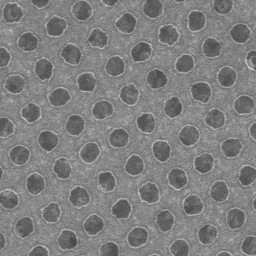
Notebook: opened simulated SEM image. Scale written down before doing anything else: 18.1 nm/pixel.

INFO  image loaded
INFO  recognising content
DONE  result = a regular array of raised bodies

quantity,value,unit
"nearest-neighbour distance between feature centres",562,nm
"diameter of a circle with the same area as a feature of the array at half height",376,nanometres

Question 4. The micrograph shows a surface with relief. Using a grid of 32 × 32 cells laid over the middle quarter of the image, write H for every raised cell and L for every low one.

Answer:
LLLLLLLLLLHHHHHLLLLLLLLLLLLLHHHH
LLLLLLLLLLHHHHHLLLLLLLHHLLLLHHHH
LLLLLHHLLLLHHHHLLLLLLHHHHLLLLLLL
LLLHHHHHLLLLLLLLLLLLLHHHHHLLLLLL
LLLHHHHHLLLLLLLLLLLLLHHHHHLLLLLL
LLLLHHHHLLLLLLLHHHLLLHHHHLLLLLLL
HLLLHHHLLLLLLLHHHHHLLLLLLLLLLLLL
HLLLLLLLLLLLLLHHHHHLLLLLLLLLLLLL
HHLLLLLLLLLLLLHHHHHLLLLLLLHHHLLL
HLLLLLLLLHHLLLLHHHLLLLLLLHHHHLLL
LLLLLLLHHHHHLLLLLLLLLLLLLHHHHHLL
LLLLLLLHHHHHLLLLLLLLLLLLLHHHHHLL
LLLLLLLHHHHHLLLLLLLLHHLLLHHHHLLL
LHHHHLLLHHLLLLLLLLHHHHHLLLLLLLLL
LHHHHLLLLLLLLLLLLLHHHHHLLLLLLLLL
HHHHHLLLLLLLLLLLLLHHHHHLLLLLLLHH
HHHHHLLLLLLLHHHLLLLHHHHLLLLLLHHH
LHHHLLLLLLLLHHHHLLLLLLLLLLLLLHHH
LLLLLLLLLLLHHHHHLLLLLLLLLLLLLHHH
LLLLLLLLLLLHHHHHLLLLLLLHHHLLLHHH
LLLLLHHHLLLLHHHLLLLLLLHHHHLLLLHH
LLLLHHHHHLLLLLLLLLLLLLHHHHHLLLLL
LLLLHHHHHLLLLLLLLLLLLLHHHHHLLLLL
LLLLHHHHLLLLLLLLHHHLLLLHHHLLLLLL
HLLLLHHLLLLLLLLLHHHHLLLLLLLLLLLL
HHLLLLLLLLLLLLLHHHHHLLLLLLLLLLLL
HHLLLLLLLLLLLLLHHHHHLLLLLLLHHHLL
HHLLLLLLLHHHLLLLHHHLLLLLLLHHHHLL
HLLLLLLLLHHHHLLLLLLLLLLLLLHHHHHL
LLLLLLLLHHHHHLLLLLLLLLLLLLHHHHHL
LLLLLLLLLHHHHLLLLLLLHHHLLLLHHHLL
LLHHHHLLLHHHLLLLLLLHHHHHLLLLLLLL